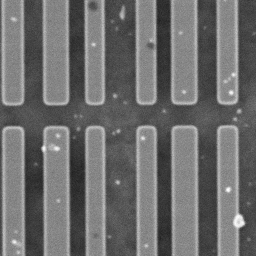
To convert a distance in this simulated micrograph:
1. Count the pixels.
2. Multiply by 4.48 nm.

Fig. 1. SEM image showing groups of lines, slits or small figures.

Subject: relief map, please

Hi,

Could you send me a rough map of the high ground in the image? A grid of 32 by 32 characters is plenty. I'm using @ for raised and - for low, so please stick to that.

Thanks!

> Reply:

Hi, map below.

@@@--@@@---@@----@@--@@@@--@@@--
@@@--@@@---@@----@@--@@@@--@@@--
@@@--@@@---@@----@@--@@@@--@@@--
@@@--@@@---@@----@@--@@@@--@@@--
@@@--@@@---@@----@@--@@@@--@@@--
@@@--@@@---@@----@@--@@@@--@@@--
@@@--@@@---@@----@@--@@@@--@@@--
@@@--@@@@--@@----@@--@@@@--@@@--
@@@--@@@@--@@----@@--@@@@--@@@--
@@@--@@@@--@@----@@--@@@@--@@@--
@@@--@@@@--@@----@@--@@@@--@@@--
@@@--@@@@--@@----@@--@@@@--@@@--
@@@--@@@@--@@----@@--@@@@--@@@--
--------------------------------
--------------------------------
--------------------------------
@@@--@@@@--@@----@@--@@@@--@@@--
@@@--@@@@--@@----@@--@@@@--@@@--
@@@--@@@@--@@----@@--@@@@--@@@--
@@@--@@@@--@@----@@--@@@@--@@@--
@@@--@@@@--@@----@@--@@@@--@@@--
@@@--@@@@--@@----@@--@@@@--@@@--
@@@---@@@--@@----@@---@@@--@@@--
@@@---@@@--@@----@@---@@@--@@@--
@@@---@@@--@@----@@---@@@--@@@--
@@@---@@@--@@----@@---@@@--@@@--
@@@---@@@--@@----@@---@@@--@@@--
@@@---@@@--@@----@@---@@@--@@@--
@@@---@@@--@@----@@---@@@--@@@--
@@@---@@@--@@----@@---@@@--@@@--
@@@---@@@--@@----@@@--@@@--@@@--
@@@---@@@--@@----@@@--@@@--@@@--